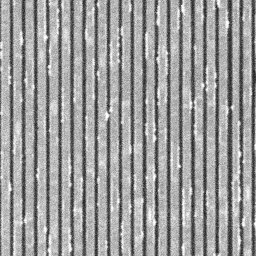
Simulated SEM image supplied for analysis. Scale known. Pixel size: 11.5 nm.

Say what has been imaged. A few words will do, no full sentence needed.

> parallel lines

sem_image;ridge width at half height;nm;84.6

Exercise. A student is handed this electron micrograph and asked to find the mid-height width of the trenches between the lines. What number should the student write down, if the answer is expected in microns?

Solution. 0.0516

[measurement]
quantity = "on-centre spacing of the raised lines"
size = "139 nm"